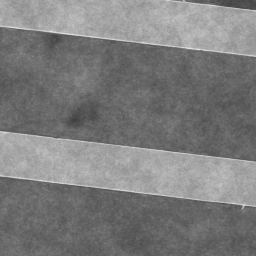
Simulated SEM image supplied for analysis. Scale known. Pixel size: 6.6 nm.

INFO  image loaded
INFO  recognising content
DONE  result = one or a few lines or trenches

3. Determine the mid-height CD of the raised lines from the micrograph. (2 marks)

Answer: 296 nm